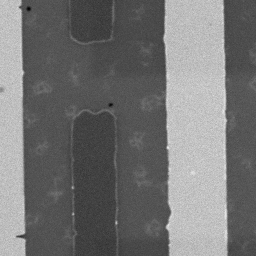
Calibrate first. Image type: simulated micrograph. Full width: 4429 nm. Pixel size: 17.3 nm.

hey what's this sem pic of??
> one or a few lines or trenches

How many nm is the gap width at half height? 886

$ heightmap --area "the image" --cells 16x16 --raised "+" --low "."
+...+++...++++..
+...+++...++++..
+....++...++++..
+.........++++..
+.........++++..
+.........++++..
+.........++++..
+....++...++++..
+...+++...++++..
+...+++....+++..
+....++....+++..
+....++....+++..
+....++....+++..
++...++....+++..
+....++....+++..
++...++....+++..